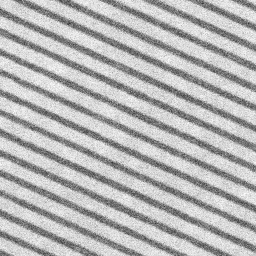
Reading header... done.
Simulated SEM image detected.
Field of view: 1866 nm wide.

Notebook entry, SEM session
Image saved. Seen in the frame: parallel lines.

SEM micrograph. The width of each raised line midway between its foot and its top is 81.2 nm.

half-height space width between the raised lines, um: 0.0497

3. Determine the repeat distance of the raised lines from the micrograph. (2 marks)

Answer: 134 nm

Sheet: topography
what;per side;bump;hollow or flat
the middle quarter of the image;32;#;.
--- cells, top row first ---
#....######.....#######....#####
###....#######....#######....###
#####....#######....#######....#
#######.....######....#######...
..#######.....######....#######.
.....#######....######.....#####
###....#######....#######....###
#####....#######....#######....#
#######....#######....#######...
..#######....#######.....######.
.....######.....#######....#####
##.....#######....#######....###
#####....#######....#######....#
#######....#######....#######...
..#######.....######....#######.
.....#######....######.....#####
##.....#######....######.....###
#####....#######....#######....#
#######....#######....#######...
..#######....#######....#######.
.....######.....######.....#####
###....######.....######.....###
####.....#######....######.....#
#######....#######....#######...
..#######....#######....#######.
....#######....#######....######
##.....######....#######.....###
#####....######.....#######....#
#######....######.....#######...
..#######.....######....#######.
....#######....#######.....#####
##....#######.....######.....###